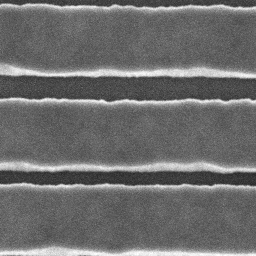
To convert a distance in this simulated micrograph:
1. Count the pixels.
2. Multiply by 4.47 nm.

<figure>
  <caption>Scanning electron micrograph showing lines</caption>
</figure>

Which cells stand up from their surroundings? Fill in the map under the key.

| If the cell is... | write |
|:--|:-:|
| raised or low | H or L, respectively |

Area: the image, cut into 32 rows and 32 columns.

LLLLLLLLLLLLLLLLLLLLLLLLLLLLLLLL
HHHHHHHHHHHHHHHHHHHHHHHHHHHHHHHH
HHHHHHHHHHHHHHHHHHHHHHHHHHHHHHHH
HHHHHHHHHHHHHHHHHHHHHHHHHHHHHHHH
HHHHHHHHHHHHHHHHHHHHHHHHHHHHHHHH
HHHHHHHHHHHHHHHHHHHHHHHHHHHHHHHH
HHHHHHHHHHHHHHHHHHHHHHHHHHHHHHHH
HHHHHHHHHHHHHHHHHHHHHHHHHHHHHHHH
HHHHHHHHHHHHHHHHHHHHHHHHHHHHHHHH
LLLLLLLLLLLLLLLLLLLLLLLLLLLLLLHH
LLLLLLLLLLLLLLLLLLLLLLLLLLLLLLLL
LLLLLLLLLLLLLLLLLLLLLLLLLLLLLLLL
HHHHLHHHHLLLLLLLLLLLLLLHHLLLLLHL
HHHHHHHHHHHHHHHHHHHHHHHHHHHHHHHH
HHHHHHHHHHHHHHHHHHHHHHHHHHHHHHHH
HHHHHHHHHHHHHHHHHHHHHHHHHHHHHHHH
HHHHHHHHHHHHHHHHHHHHHHHHHHHHHHHH
HHHHHHHHHHHHHHHHHHHHHHHHHHHHHHHH
HHHHHHHHHHHHHHHHHHHHHHHHHHHHHHHH
HHHHHHHHHHHHHHHHHHHHHHHHHHHHHHHH
HHHHHHHHHHHHHHHHHHHHHHHHHHHHHHHH
LLLLLLLLLLLLLLLLLLLLLLLLLLLLLLLL
LLLLLLLLLLLLLLLLLLLLLLLLLLLLLLLL
HHHHHHHHHHHHHHHHHHHHHHHHHHHHHHHH
HHHHHHHHHHHHHHHHHHHHHHHHHHHHHHHH
HHHHHHHHHHHHHHHHHHHHHHHHHHHHHHHH
HHHHHHHHHHHHHHHHHHHHHHHHHHHHHHHH
HHHHHHHHHHHHHHHHHHHHHHHHHHHHHHHH
HHHHHHHHHHHHHHHHHHHHHHHHHHHHHHHH
HHHHHHHHHHHHHHHHHHHHHHHHHHHHHHHH
HHHHHHHHHHHHHHHHHHHHHHHHHHHHHHHH
HHHHHHHHHHHHHHHHHHHHHHHHHHHHHHHH